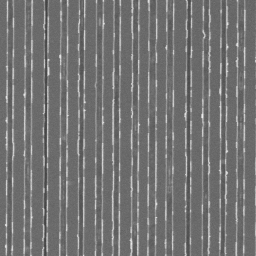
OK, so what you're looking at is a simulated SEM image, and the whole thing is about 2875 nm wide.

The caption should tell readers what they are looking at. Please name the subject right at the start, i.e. parallel lines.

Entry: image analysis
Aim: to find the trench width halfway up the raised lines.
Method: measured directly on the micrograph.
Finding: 66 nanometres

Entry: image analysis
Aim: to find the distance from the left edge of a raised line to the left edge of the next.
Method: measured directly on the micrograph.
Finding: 199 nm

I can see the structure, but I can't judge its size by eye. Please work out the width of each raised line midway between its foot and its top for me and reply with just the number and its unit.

143 nm